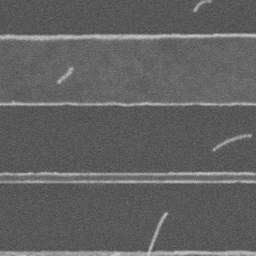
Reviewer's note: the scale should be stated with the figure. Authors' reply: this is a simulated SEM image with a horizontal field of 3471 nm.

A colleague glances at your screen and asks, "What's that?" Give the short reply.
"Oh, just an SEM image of lines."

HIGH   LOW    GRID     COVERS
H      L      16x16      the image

LLLLLLLLLLLLLLLL
LLLLLLLLLLLLLLLL
HHHHHHHHHHHHHHHH
HHHHHHHHHHHHHHHH
HHHHHHHHHHHHHHHH
HHHHHHHHHHHHHHHH
HHHHHHHHHHHHHHHH
LLLLLLLLLLLLLLLL
LLLLLLLLLLLLLLLL
LLLLLLLLLLLLLLLL
LLLLLLLLLLLLLLLL
LLLLLLLLLLLLLLLL
LLLLLLLLLLLLLLLL
LLLLLLLLLLLLLLLL
LLLLLLLLLLLLLLLL
LLLLLLLLLLLLLLLL